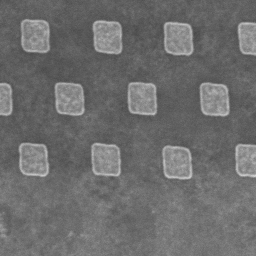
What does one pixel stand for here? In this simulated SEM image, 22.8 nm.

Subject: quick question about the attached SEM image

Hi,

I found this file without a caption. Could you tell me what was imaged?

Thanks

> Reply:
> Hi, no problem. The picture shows a regular array of raised bodies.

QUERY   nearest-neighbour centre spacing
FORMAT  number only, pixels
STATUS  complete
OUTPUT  70.6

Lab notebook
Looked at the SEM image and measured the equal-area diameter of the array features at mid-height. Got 731 nm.